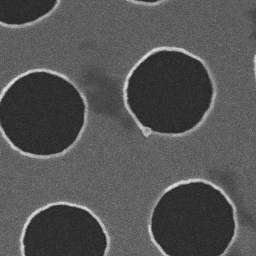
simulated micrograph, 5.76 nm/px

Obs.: holes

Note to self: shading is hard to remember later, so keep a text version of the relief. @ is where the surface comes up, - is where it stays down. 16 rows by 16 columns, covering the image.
---@@@@@@@@@@@@@
@@@@@@@@@@@@@@@@
@@@@@@@@@@@@@@@@
@@@@@@@@@---@@@@
@@@@@@@@-----@@@
@----@@@-----@@@
-----@@@-----@@@
-----@@@@----@@@
-----@@@@@@@@@@@
@@--@@@@@@@@@@@@
@@@@@@@@@@@@@@@@
@@@@@@@@@@@@-@@@
@@@@@@@@@@----@@
@@----@@@@-----@
@@----@@@@-----@
@@-----@@@----@@